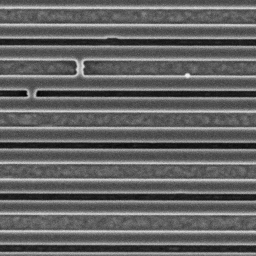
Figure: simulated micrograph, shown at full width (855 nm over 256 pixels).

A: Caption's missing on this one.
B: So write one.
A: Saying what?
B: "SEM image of parallel lines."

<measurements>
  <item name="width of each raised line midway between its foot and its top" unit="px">15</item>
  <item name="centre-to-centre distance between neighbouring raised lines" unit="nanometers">86.3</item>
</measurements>